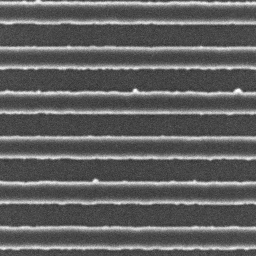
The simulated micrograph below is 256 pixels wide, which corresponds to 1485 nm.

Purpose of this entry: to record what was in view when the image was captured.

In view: lines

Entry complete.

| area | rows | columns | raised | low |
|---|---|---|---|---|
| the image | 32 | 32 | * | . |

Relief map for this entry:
********************************
********************************
********************************
................................
................................
................................
********************************
********************************
*.***..***********.***.*.**.*..*
................................
................................
**..*..**.***.*.*********....*..
********************************
********************************
................................
................................
................................
********************************
********************************
********************************
................................
................................
................................
********************************
********************************
................................
................................
................................
********************************
********************************
********************************
................................